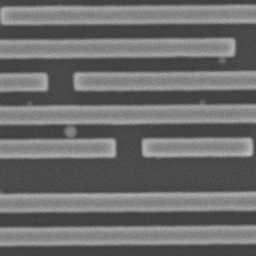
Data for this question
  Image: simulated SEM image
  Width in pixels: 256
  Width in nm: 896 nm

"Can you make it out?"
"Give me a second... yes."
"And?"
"groups of lines, slits or small figures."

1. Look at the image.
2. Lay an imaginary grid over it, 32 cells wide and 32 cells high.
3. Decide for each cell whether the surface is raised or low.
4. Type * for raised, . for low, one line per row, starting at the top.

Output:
................................
********************************
********************************
................................
................................
*****************************...
*****************************...
................................
................................
******...***********************
******...***********************
................................
................................
********************************
********************************
................................
................................
.*.***********....*************.
**************....*************.
*************...................
................................
................................
................................
................................
********************************
********************************
................................
................................
********************************
********************************
*************...................
................................